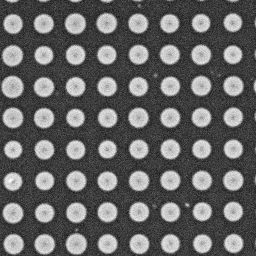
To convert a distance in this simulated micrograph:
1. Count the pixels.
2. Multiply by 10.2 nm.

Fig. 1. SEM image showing an array of small figures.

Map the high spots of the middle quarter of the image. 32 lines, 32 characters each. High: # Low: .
................................
................................
................................
..##......##......#.......#.....
.####....####....###.....####...
.####....####...#####...#####...
.####....####...#####...#####...
.###.....###.....###.....###....
................................
................................
................................
..##......##.....###.....###....
.####....####...#####...#####...
.####....####...#####...#####...
.####....####...#####....####...
..##......##.....###.....###....
................................
................................
................................
..##......##.....###.....###....
.####....####....####...#####...
.####....####....####...#####...
.####....####....####...#####...
..##..............#.......##....
................................
................................
................................
.####....###.....###.....###....
.####....####...#####...#####...
.####....####...#####...#####...
.####....####....####....####...
..##......##......##............